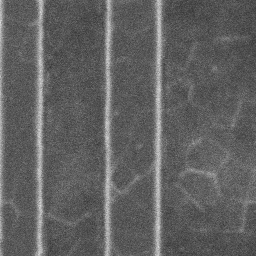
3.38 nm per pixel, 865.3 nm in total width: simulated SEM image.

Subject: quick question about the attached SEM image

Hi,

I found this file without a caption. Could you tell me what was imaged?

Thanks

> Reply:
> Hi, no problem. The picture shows one or a few lines or trenches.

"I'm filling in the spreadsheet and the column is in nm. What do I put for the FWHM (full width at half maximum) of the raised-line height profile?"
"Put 175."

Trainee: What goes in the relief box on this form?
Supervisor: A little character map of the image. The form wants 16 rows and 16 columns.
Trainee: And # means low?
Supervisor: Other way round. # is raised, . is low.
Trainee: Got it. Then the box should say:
###....###......
###....###......
###....###......
###....###......
###....###......
###....###......
###....###......
###....###......
##.....###......
###....###......
###....###......
###....###......
###....###......
###....###......
###....###......
###....###......